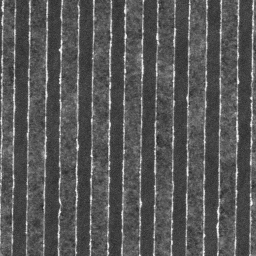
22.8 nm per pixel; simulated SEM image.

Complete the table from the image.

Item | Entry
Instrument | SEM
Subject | parallel lines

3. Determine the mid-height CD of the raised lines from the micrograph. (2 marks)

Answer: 344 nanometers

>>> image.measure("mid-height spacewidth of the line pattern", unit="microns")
0.372